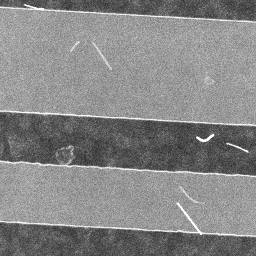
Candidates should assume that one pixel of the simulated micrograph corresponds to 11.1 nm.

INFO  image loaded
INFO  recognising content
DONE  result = one or a few lines or trenches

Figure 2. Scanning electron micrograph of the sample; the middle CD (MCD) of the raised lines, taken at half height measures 0.57 um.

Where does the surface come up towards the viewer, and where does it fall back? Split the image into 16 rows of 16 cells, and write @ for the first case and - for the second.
@@@@@@@@@@@@@@@@
----------------
----------------
----------------
----------------
----------------
----------------
@@@@@@@@@@------
@@@@@@@@@@@@@@@@
@@@@@@@@@@@@@@@@
-------@@@@@@@@@
----------------
----------------
----------------
@@@@@@@@@@@@----
@@@@@@@@@@@@@@@@